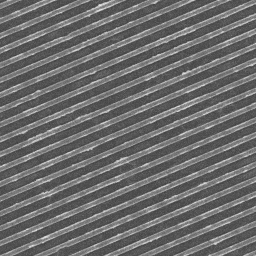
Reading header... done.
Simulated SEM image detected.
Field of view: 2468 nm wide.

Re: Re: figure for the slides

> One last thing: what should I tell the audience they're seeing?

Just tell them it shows parallel lines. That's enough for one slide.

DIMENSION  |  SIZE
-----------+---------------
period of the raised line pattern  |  131 nanometers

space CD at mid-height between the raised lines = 88.7 nanometers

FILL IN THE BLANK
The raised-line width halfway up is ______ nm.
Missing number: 44.4